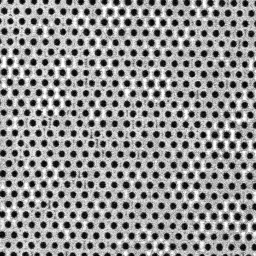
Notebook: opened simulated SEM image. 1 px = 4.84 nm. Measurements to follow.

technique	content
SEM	a regular array of holes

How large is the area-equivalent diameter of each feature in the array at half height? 32.8 nanometers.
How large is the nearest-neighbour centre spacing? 11.5 px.